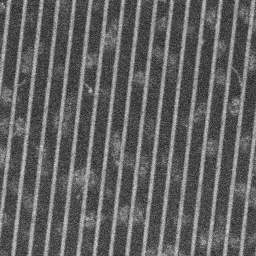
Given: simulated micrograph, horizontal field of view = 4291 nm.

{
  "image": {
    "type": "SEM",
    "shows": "parallel lines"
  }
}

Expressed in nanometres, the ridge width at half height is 37.5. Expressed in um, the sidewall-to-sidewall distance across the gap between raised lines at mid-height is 0.237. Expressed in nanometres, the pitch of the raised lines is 271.